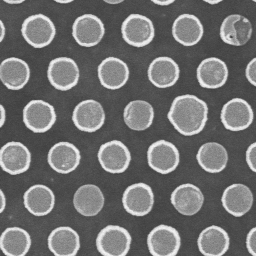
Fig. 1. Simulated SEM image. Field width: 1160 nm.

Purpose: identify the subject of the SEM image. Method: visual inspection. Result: a regular array of raised bodies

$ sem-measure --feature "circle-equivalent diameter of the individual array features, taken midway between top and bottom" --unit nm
143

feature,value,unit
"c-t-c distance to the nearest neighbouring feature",220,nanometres